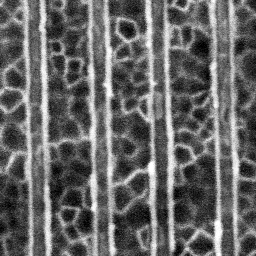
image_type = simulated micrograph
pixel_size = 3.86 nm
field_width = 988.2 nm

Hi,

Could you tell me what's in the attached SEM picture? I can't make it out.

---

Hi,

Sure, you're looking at parallel lines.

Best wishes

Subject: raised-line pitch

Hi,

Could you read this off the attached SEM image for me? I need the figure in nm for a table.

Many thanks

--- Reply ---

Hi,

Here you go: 236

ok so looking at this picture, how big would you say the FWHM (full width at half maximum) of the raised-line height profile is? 188 nm